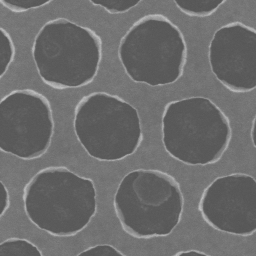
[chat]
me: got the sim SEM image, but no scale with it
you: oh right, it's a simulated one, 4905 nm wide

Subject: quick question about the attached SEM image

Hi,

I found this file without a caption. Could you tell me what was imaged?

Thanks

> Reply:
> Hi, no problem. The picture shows holes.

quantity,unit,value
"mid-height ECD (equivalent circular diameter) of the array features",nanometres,1260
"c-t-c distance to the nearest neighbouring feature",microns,1.64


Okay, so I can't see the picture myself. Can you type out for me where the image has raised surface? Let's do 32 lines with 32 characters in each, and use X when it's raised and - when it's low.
X----XXXXXXX-----XXXXX-----XXXXX
XXXXXXXXXXXXXXXXXXXXXXXX--XXXXXX
XXXXXXXXXXXXXXXXXX--XXXXXXXXXXXX
XXXXX-----XXXXXXX-----XXXXXX--XX
-XXXX------XXXXX-------XXXX-----
-XXX--------XXX--------XXX------
-XXX--------XXX--------XXX------
-XXX--------XXX--------XXX------
-XXXX-------XXXX------XXXX------
XXXXX-------XXXX------XXXXX-----
XXXXXXXX--XXXXXXXXX-XXXXXXXX----
XXXXXXXXXXXXXXXXXXXXXXXXXXXXXXXX
X----XXXXXX----XXXXXXXX---XXXXXX
------XXXX-------XXXX------XXXXX
------XXXX-------XXXX-------XXXX
-------XX--------XXX--------XXXX
-------XXX--------XXX--------XXX
------XXXX-------XXX--------XXXX
------XXXXX------XXXX-------XXXX
XX---XXXXXXX----XXXXXX-----XXXXX
XXXXXXXXXXXXXXXXXXXXXXXXX-XXXXXX
XXXXX----XXXXXXXX--XXXXXXXXXXXXX
XXXX-------XXXX------XXXXXX-----
-XXX--------XXX-------XXXX------
-XX---------XX---------XXX------
-XX---------XX---------XX-------
XXX---------XXX--------XXX------
XXXX-------XXXX-------XXXX------
XXXXX-----XXXXXX------XXXXX-----
XXXXXXXXXXXXXXXXXXXXXXXXXXXXXXXX
----XXXXXXXXXXXXXXXXXXXXXXXXXXXX
-----XXXXXX----XXXXXXXXXXXXXXXXX